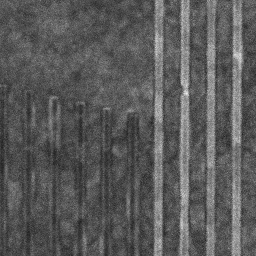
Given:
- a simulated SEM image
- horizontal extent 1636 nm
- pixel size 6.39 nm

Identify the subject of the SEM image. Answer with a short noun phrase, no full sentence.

parallel lines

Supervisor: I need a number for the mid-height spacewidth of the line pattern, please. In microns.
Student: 0.125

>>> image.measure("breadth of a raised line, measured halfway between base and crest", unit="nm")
45.6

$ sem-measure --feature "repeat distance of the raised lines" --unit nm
166